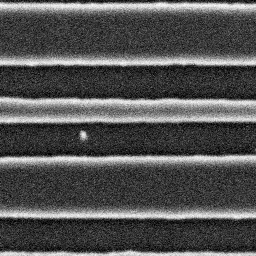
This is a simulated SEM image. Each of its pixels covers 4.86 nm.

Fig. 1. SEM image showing lines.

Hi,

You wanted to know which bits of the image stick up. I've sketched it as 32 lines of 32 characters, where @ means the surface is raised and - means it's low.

-------------------@@-----------
@@@@@@@@@@@@@@@@@@@@@@@@@@@@@@@@
@@@@@@@@@@@@@@@@@@@@@@@@@@@@@@@@
@@@@@@@@@@@@@@@@@@@@@@@@@@@@@@@@
@@@@@@@@@@@@@@@@@@@@@@@@@@@@@@@@
@@@@@@@@@@@@@@@@@@@@@@@@@@@@@@@@
@@@@@@@@@@@@@@@@@@@@@@@@@@@@@@@@
@@@@@@@@@@@@@@@@@@@@@@@@@@@@@@@@
--------------------------------
--------------------------------
--------------------------------
--------------------------------
@@@@-@@@@@@@@@@-----@@@---------
@@@@@@@@@@@@@@@@@@@@@@@@@@@@@@@@
@@@@@@@@@@@@@@@@@@@@@@@@@@@@@@@@
--------------------------------
--------------------------------
--------------------------------
--------------------------------
--------------------------------
@@@@@@@@@@@@@@@@@@@@@@@@@@@@@@@@
@@@@@@@@@@@@@@@@@@@@@@@@@@@@@@@@
@@@@@@@@@@@@@@@@@@@@@@@@@@@@@@@@
@@@@@@@@@@@@@@@@@@@@@@@@@@@@@@@@
@@@@@@@@@@@@@@@@@@@@@@@@@@@@@@@@
@@@@@@@@@@@@@@@@@@@@@@@@@@@@@@@@
@@@@@@@@@@@@@@@@@@@@@@@@@@@@@@@@
--------------------------------
--------------------------------
--------------------------------
--------------------------------
----------------@---------------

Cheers